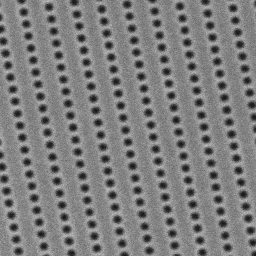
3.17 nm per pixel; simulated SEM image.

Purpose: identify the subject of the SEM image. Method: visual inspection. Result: a regular array of holes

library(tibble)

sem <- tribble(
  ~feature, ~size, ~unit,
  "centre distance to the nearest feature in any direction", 38.6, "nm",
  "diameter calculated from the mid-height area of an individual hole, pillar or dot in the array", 27.5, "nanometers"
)